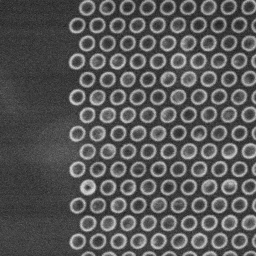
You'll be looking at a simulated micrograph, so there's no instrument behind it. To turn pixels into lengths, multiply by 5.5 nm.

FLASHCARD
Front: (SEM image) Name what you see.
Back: a regular array of raised bodies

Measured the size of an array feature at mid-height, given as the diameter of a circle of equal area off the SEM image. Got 81.6 nm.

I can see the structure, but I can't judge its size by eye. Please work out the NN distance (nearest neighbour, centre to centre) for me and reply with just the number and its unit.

20 pixels